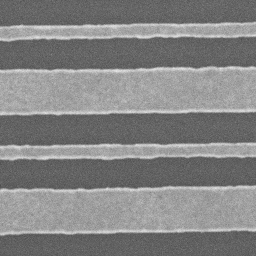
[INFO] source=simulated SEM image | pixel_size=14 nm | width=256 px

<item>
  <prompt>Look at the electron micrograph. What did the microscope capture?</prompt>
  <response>lines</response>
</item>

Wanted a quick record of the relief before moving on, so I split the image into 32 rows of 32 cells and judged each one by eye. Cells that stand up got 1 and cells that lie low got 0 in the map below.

00000000000000000000000000000000
00000000000000000000000000000000
00000000000000000000000000000000
11111111111111111111111111111111
11111111111111111111111011111100
00000000000000000000000000000000
00000000000000000000000000000000
00000000000000000000000000000000
00000000000000000000000000101100
11111111111111111111111111111111
11111111111111111111111111111111
11111111111111111111111111111111
11111111111111111111111111111111
11111111111111111111111111111111
00000000000000000000000000000000
00000000000000000000000000000000
00000000000000000000000000000000
00000000000000000000000000000000
11111111111111111111111111111111
11111111111111111111111111111111
00000000000000000000000000000000
00000000000000000000000000000000
00000000000000000000000000000000
00000000000000000000111111111111
11111111111111111111111111111111
11111111111111111111111111111111
11111111111111111111111111111111
11111111111111111111111111111111
11111111111111111111111111111111
00000000000000000000000000000000
00000000000000000000000000000000
00000000000000000000000000000000